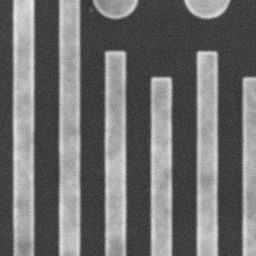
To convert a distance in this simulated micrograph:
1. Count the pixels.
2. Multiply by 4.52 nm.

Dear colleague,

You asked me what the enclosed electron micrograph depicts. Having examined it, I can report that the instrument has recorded groups of lines, slits or small figures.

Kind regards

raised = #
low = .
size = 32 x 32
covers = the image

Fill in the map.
..##....##..#####......#####....
..##....##...###........####....
..##....##......................
..##....##......................
..##....##......................
..##....##......................
..##....##......................
..##....##...###.........##.....
..##....##...###.........##.....
..##....##...###.........##.....
..##....##...###...##....##...##
..##....##...###...##....##...##
..##....##...###...##....##....#
..##....##...###...##....##...##
..##....##...###...##....##...##
..##....##...###...##....##...##
..##....##...###...##....##....#
..##....##...###...##....##....#
..##....##...###...##....##....#
..##....##...###...##....##...##
..##....##...###...##....##...##
..##....##...###...##....##...##
..##....##...###...##....##....#
..##....##...###...##....##....#
..##....##...###...##....##....#
..##....##...###...##....##....#
..##....##...###...##....##....#
..##....##...###...##....##...##
..##....##...###...##....##...##
..##....##...###...##....##...##
..##....##...###...##....##...##
..##....##...###...##....##....#